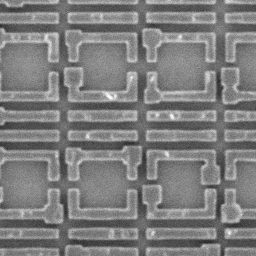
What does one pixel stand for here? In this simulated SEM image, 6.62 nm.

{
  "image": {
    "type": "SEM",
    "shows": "wiring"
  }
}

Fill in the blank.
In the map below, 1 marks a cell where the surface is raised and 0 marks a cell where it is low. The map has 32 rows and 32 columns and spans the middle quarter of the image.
00000000000000000000000000000000
11111000000000000000000000000000
11111000000000001100011000000000
11111000000000001100011000000000
11111000000000001100011000000000
01110000000000001100011000000000
01110000000000001100111100000000
01111111111111111100111111111111
01111111111111111100111111111111
00000000000000000000111100000000
00000000000000000000000000000000
00000000000000000000000000000000
01111111111111111100011111111111
01111111111111111100011111111111
00000000000000000000000000000000
00000000000000000000000000000000
00000000000000000000000000000000
01111111111111111100011111111111
01111111111111111100011111111111
00000000000000000000000000000000
00000000000000000000000000000000
01111000000000111110000000000000
01111111111111111110011111111111
01111111111111111110011111111111
01110000000000011110011000000000
01100000000000001100011000000000
01100000000000001100011000000000
01100000000000001100011000000000
01100000000000001100011000000000
00000000000000000000000000000000
00000000000000000000111100000000
01100000000000000000111100000000